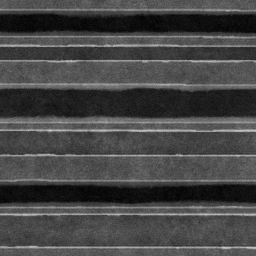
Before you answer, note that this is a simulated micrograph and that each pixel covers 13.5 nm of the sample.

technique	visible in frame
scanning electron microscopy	lines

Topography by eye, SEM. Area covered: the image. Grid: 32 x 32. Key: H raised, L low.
HHHHHHHHHHHHHHHHHHHHHHHHHHHHHHHH
LLLLLLLLLLLLLLLLLLLLLLLLLLLLLLLL
LLLLLLLLLLLLLLLLLLLLLLLLLLLLLLLL
LLLLLLLLLLLLLLLLLLLLLLLLLLLLLLLL
LLLLLLLLLLLLLLLLLLLLLLLLLLLLLLLL
HHHHHHHHHHHHHHHHHHHHHHHHHHHHHHHH
HHHHHHHHHHHHHHHHHHHHHHHHHHHHHHHH
HHHHHHHHHHHHHHHHHHHHHHHHHHHHHHHH
HHHHHHHHHHHHHHHHHHHHHHHHHHHHHHHH
HHHHHHHHHHHHHHHHHHHHHHHHHHHHHHHH
HHHHHHHHHHHHHHHHHHHHHHHHHHHHHHHH
LLLLLLLLLLLLLLLLLLLLLLLLLLLLLLLL
LLLLLLLLLLLLLLLLLLLLLLLLLLLLLLLL
LLLLLLLLLLLLLLLLLLLLLLLLLLLLLLLL
LLLLLLLLLLLLLLLLLLLLLLLLLLLLLLLL
HHHHHHHHHHHHHHHHHHHHHHHHHHHHHHHH
HHHHHHHHHHHHHHHHHHHHHHHHHHHHHHHH
HHHHHHHHHHHHHHHHHHHHHHHHHHHHHHHH
HHHHHHHHHHHHHHHHHHHHHHHHHHHHHHHH
HHHHHHHHHHHHHHHHHHHHHHHHHHHHHHHH
HHHHHHHHHHHHHHHHHHHHHHHHHHHHHHHH
HHHHHHHHHHHHHHHHHHHHHHHHHHHHHHHH
HHHHHHHHHHHHHHHHHHHHHHHHHHHHHHHH
LLLLLLLLLLLLLLLLLLLLLLLLLLLLLLLL
LLLLLLLLLLLLLLLLLLLLLLLLLLLLLLLL
LLLLLLLLLLLLLLLLLLLLLLLLLLLLLLLL
HHHHHHHHHHHHHHHHHHHHHHHHHHHHHHHH
HHHHHHHHHHHHHHHHHHHHHHHHHHHHHHHH
HHHHHHHHHHHHHHHHHHHHHHHHHHHHHHHH
HHHHHHHHHHHHHHHHHHHHHHHHHHHHHHHH
HHHHHHHHHHHHHHHHHHHHHHHHHHHHHHHH
HHHHHHHHHHHHHHHHHHHHHHHHHHHHHHHH